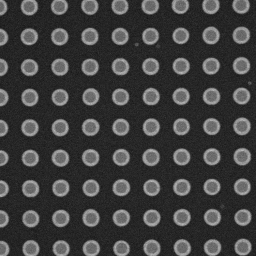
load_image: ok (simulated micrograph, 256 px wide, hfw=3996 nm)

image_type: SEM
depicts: an array of small figures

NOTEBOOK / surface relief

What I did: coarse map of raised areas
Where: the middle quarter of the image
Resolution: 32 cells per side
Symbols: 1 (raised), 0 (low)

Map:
10000111100011110000111100011110
10000111000011110000111000011110
00000111000001100000011000000100
00000000000000000000000000000000
00000000000000000000000000000000
00000000000000000000000000000000
00000011000001100000011000001110
10000111100011110000111100011110
10000111100011110000111100011110
10000111000001110000111000001110
00000000000000000000000000000000
00000000000000000000000000000000
00000000000000000000000000000000
00000000000000000000000000000000
10000111000001110000111000001110
10000111100011110000111100011110
10000111100011110000111100011110
00000111000001110000011000001100
00000000000000000000000000000000
00000000000000000000000000000000
00000000000000000000000000000000
00000010000001100000011000001110
10000111100011110000111100011110
10000111100011110000111100011110
10000111000001110000111100001110
00000000000000000000000000000000
00000000000000000000000000000000
00000000000000000000000000000000
00000000000000000000000000000000
10000111000001110000111000001110
10000111100011110000111100011111
10000111100011110000111100011111